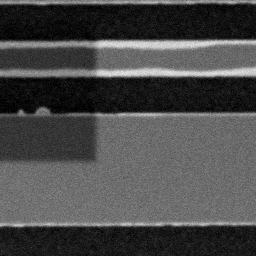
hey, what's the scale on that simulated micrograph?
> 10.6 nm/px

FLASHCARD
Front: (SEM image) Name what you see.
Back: lines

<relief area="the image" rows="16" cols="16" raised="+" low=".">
................
................
................
++++++++++++++++
++++++++++++++++
................
................
++++++++++++++++
++++++++++++++++
++++++++++++++++
++++++++++++++++
++++++++++++++++
++++++++++++++++
++++++++++++++++
................
................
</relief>